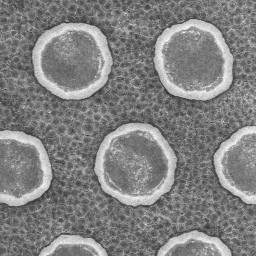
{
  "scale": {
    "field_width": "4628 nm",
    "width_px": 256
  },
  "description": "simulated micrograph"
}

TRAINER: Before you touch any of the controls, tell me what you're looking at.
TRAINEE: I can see raised bodies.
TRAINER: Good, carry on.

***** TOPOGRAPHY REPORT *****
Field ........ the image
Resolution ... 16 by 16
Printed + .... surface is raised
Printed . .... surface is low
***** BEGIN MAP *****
................
................
...+++....++++..
..+++++...++++..
..+++++...++++..
...+++.....+++..
................
................
+......+++.....+
+++...+++++...++
+++...+++++...++
+++...++++....++
++......+.......
................
................
...+++....++++..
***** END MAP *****